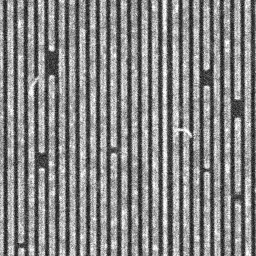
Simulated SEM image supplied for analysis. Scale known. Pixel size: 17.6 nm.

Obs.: parallel lines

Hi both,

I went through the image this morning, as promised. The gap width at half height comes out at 0.101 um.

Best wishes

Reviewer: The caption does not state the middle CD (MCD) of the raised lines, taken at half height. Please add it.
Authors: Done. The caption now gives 85.9 nanometres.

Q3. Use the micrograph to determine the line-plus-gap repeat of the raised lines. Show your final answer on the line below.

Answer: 10.3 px